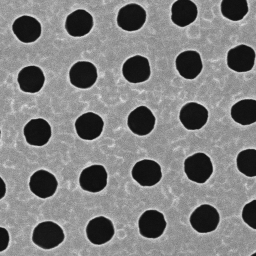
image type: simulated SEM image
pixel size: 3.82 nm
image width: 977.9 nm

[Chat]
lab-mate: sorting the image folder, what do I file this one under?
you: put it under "a regular array of holes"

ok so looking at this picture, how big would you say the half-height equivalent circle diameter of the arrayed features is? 0.106 microns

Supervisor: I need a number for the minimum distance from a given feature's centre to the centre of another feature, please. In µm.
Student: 0.197